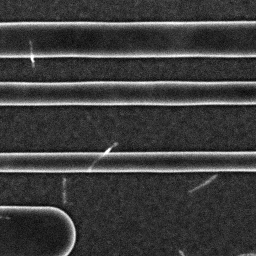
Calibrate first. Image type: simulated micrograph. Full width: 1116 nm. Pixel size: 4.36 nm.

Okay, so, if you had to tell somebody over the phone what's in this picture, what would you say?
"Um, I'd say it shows groups of lines, slits or small figures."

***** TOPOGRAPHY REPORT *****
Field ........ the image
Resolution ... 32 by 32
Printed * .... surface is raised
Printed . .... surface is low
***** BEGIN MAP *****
................................
................................
................................
********************************
********************************
********************************
********************************
................................
................................
................................
********************************
********************************
********************************
................................
................................
................................
................................
................................
................................
********************************
********************************
................................
................................
................................
................................
................................
********........................
*********.......................
*********.......................
*********.......................
*********.......................
*********.......................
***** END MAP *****